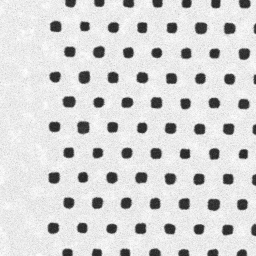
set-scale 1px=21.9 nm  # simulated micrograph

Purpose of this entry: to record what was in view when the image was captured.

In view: a regular array of holes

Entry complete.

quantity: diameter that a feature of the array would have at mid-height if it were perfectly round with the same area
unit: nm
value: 268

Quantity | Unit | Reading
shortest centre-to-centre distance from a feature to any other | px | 28.5